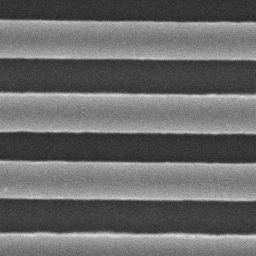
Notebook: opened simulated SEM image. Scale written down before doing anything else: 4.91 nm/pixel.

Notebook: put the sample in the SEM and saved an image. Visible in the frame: lines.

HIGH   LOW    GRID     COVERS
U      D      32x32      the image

DDDDDDDDDDDDDDDDDDDDDDDDDDDDDDDD
DDDDDDDDDDDDDDDDDDDDDDDDDDDDDDDD
DDDDDDDDDDDDDDDDDDDDDDDDDDDDDDDD
UUUUUUUUUUUUUUUUUUUUUUUUUUUUUUUU
UUUUUUUUUUUUUUUUUUUUUUUUUUUUUUUU
UUUUUUUUUUUUUUUUUUUUUUUUUUUUUUUU
UUUUUUUUUUUUUUUUUUUUUUUUUUUUUUUU
DDDDDDDDDDDDDDDDDDDDDDDDDDDDDDDD
DDDDDDDDDDDDDDDDDDDDDDDDDDDDDDDD
DDDDDDDDDDDDDDDDDDDDDDDDDDDDDDDD
DDDDDDDDDDDDDDDDDDDDDDDDDDDDDDDD
DDDDDDDDDDDDDDDDDDDDDDDDDDDDDDDD
UUUUUUUUUUUUUUUUUUUUUUUUUUUUUUUU
UUUUUUUUUUUUUUUUUUUUUUUUUUUUUUUU
UUUUUUUUUUUUUUUUUUUUUUUUUUUUUUUU
UUUUUUUUUUUUUUUUUUUUUUUUUUUUUUUU
DDDDDDDDDDDDDDDDUDDDUUUUUUUUUUUU
DDDDDDDDDDDDDDDDDDDDDDDDDDDDDDDD
DDDDDDDDDDDDDDDDDDDDDDDDDDDDDDDD
DDDDDDDDDDDDDDDDDDDDDDDDDDDDDDDD
UUUUUUUUUUUUUUUUUUUUUUUUUUUUDDUU
UUUUUUUUUUUUUUUUUUUUUUUUUUUUUUUU
UUUUUUUUUUUUUUUUUUUUUUUUUUUUUUUU
UUUUUUUUUUUUUUUUUUUUUUUUUUUUUUUU
UUUUUUUUUUUUUUUUUUUUUUUUUUUUUUUU
DDDDDDDDDDDDDDDDDDDDDDDDDDDDDDDD
DDDDDDDDDDDDDDDDDDDDDDDDDDDDDDDD
DDDDDDDDDDDDDDDDDDDDDDDDDDDDDDDD
DDDDDDDDDDDDDDDDDDDDDDDDDDDDDDDD
UUUUUUUUUUUUUUUUUUUUUUUUUUDDUDDD
UUUUUUUUUUUUUUUUUUUUUUUUUUUUUUUU
UUUUUUUUUUUUUUUUUUUUUUUUUUUUUUUU